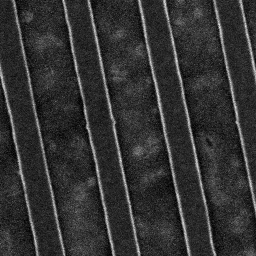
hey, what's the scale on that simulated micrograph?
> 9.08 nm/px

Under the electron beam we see one or a few lines or trenches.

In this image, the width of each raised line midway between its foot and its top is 234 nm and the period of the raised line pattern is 0.674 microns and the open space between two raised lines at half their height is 438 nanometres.